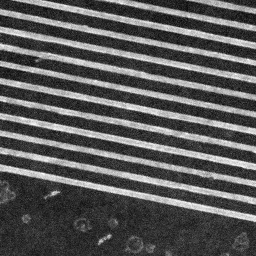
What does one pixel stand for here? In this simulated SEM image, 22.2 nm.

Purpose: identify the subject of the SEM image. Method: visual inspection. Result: parallel lines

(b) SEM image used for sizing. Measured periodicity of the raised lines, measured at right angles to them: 17 pixels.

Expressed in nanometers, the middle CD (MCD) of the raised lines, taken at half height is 109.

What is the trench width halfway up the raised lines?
0.259 µm